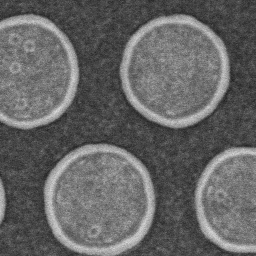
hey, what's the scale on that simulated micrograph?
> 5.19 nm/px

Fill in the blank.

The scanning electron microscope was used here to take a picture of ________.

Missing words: raised bodies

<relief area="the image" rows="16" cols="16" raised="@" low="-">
----------------
@@@------@@@----
@@@@----@@@@@@--
@@@@@---@@@@@@--
@@@@@---@@@@@@--
@@@@@---@@@@@@--
@@@@----@@@@@---
@@@-------@@----
----------------
-----@@@-------@
----@@@@@----@@@
---@@@@@@----@@@
---@@@@@@---@@@@
---@@@@@@----@@@
----@@@@@----@@@
-----@@@------@@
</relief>